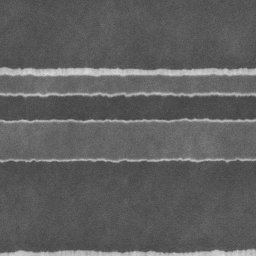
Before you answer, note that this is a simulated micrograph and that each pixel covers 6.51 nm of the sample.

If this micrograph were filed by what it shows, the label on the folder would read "lines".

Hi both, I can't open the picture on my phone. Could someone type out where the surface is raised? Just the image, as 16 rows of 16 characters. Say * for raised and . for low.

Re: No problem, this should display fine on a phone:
................
................
................
................
................
****************
****************
****************
****************
****************
................
................
................
................
................
................